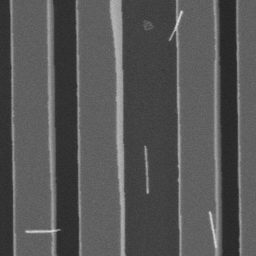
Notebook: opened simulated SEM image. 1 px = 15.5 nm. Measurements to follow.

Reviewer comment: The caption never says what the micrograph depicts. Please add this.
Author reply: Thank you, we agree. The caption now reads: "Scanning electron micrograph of lines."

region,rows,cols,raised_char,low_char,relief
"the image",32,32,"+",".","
.+++++....+++++.......+++++...++
.+++++....+++++.......+++++...++
.+++++....+++++.......+++++...++
.+++++....+++++.......+++++...++
.+++++....+++++.......+++++...++
.+++++....+++++.......+++++...++
..++++....+++++.......+++++...++
..++++....+++++.......+++++...++
..++++....+++++.......+++++...++
..++++....+++++.......+++++...++
..++++....+++++.......+++++...++
..++++....+++++.......+++++...++
..++++....+++++.......+++++...++
..++++....+++++.......+++++...++
..++++....+++++.......+++++...++
..++++....+++++.......+++++...++
..+++++...+++++.......+++++...++
..+++++...+++++.......+++++...++
..+++++...+++++.......+++++...++
..+++++...+++++.......+++++...++
..+++++...+++++.......+++++...++
..+++++...+++++.......+++++...++
..+++++...+++++.......+++++...++
..+++++...+++++.......+++++...++
..+++++...+++++.......+++++...++
..+++++...+++++.......+++++...++
..+++++...+++++.......+++++...++
..+++++...+++++.......+++++...++
..+++++...+++++........++++...++
..+++++...+++++........++++...++
..+++++...+++++........++++...++
..+++++...+++++........++++...++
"